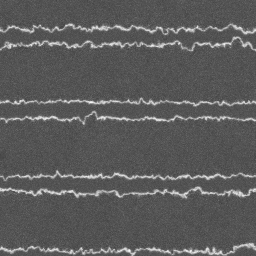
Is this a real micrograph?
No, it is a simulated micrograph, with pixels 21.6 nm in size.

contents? one or a few lines or trenches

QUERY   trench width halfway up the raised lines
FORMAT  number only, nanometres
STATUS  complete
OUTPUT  1230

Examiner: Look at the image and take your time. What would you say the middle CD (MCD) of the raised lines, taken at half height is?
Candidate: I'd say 373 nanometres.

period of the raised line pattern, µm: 1.6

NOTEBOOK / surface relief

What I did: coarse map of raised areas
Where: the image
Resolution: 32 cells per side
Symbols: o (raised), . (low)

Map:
................................
................................
................................
.o..oo..oo..ooo.o.........o.oo..
oooooooooooooooooooooooooooooooo
oooo...ooooooo.oooooo.oooooo..oo
................................
................................
................................
................................
................................
................................
................................
oooooooooooooooooooooooooooooooo
ooooooooooo.oooooooooooooooooooo
................................
................................
................................
................................
................................
................................
................................
oooooooooooooooooooooooooooooooo
oooooooooooooooooooooooooooooooo
................................
................................
................................
................................
................................
................................
................................
oooooooooooooooo.oooo.oooo...ooo